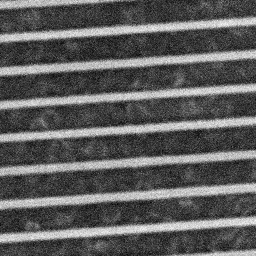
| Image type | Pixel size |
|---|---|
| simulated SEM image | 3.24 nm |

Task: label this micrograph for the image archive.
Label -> parallel lines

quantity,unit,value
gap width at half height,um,0.0877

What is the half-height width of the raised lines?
20.6 nm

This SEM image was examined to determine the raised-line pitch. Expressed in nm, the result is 108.